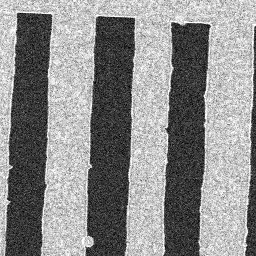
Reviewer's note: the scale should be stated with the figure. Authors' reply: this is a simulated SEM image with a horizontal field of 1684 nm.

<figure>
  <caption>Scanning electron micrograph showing one or a few lines or trenches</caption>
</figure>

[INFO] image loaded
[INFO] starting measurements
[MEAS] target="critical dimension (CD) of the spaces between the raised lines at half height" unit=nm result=249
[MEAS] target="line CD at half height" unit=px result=41.7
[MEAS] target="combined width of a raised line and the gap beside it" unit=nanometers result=522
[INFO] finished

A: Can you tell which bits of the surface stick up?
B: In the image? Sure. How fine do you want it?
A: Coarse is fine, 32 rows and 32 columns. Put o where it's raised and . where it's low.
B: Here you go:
oooooooooooooooooooooooooooooooo
oooooooooooooooooooooooooooooooo
oo.....ooooo.....ooooooooooooooo
oo.....ooooo.....oooo.....oooooo
oo....oooooo.....oooo.....oooooo
oo....oooooo.....oooo.....oooooo
oo....oooooo.....oooo.....oooooo
oo....oooooo.....oooo.....oooooo
oo....oooooo.....oooo.....oooooo
oo....oooooo.....oooo.....oooooo
oo....oooooo.....oooo.....oooooo
o.....ooooo.....ooooo.....oooooo
o.....ooooo......oooo.....oooooo
o.....ooooo......oooo.....ooooo.
o.....ooooo......oooo.....ooooo.
o.....ooooo......oooo.....ooooo.
o.....ooooo.....ooooo.....ooooo.
o.....ooooo.....ooooo.....ooooo.
o.....ooooo.....ooooo.....ooooo.
o.....ooooo.....ooooo.....ooooo.
o.....ooooo.....ooooo.....ooooo.
o.....ooooo.....ooooo.....ooooo.
o.....ooooo.....ooooo....oooooo.
o.....ooooo.....ooooo....oooooo.
o.....ooooo.....ooooo....oooooo.
o.....ooooo.....oooo.....oooooo.
o.....ooooo.....oooo.....oooooo.
o....oooooo.....oooo.....oooooo.
o....oooooo.....oooo.....oooooo.
o....oooooo.....oooo.....oooooo.
o....ooooooo....oooo.....oooooo.
o....oooooo.....oooo.....oooooo.